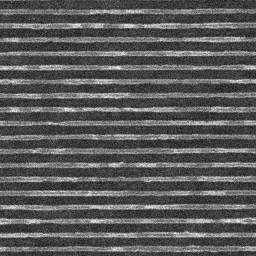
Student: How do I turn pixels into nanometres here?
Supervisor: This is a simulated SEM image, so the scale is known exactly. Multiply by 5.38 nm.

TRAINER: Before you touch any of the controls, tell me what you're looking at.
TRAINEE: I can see parallel lines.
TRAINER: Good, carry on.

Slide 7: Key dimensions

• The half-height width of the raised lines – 20.2 nm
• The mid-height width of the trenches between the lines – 0.0558 micrometres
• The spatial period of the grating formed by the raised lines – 75.1 nm